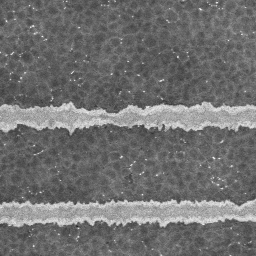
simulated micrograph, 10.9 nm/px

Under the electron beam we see one or a few lines or trenches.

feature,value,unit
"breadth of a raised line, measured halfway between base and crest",0.181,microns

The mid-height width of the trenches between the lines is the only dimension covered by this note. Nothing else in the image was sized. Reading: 849 nm